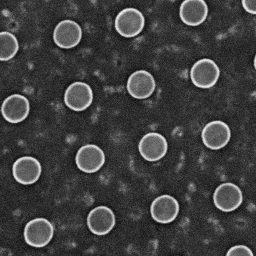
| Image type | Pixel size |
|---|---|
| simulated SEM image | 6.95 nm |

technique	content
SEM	a regular array of raised bodies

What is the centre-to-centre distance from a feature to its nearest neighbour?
438 nanometres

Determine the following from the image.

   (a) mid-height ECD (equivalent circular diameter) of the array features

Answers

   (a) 190 nm